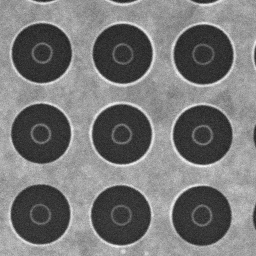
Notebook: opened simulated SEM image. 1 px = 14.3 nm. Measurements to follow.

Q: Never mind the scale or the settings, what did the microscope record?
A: an array of small figures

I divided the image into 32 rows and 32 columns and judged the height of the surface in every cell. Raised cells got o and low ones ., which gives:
ooooooooooooooo.ooooooooo.oooooo
oooooooooooooooooooooooooooooooo
oooooooooooooooooooooooooooooooo
ooo....oooooo.....ooooo....ooooo
oo......oooo.......ooo......oooo
oo.......ooo.......ooo.......ooo
o........oo........ooo.......ooo
o........ooo.......ooo.......ooo
oo.......ooo.......ooo.......ooo
ooo.....ooooo.....ooooo.....oooo
oooooooooooooo..oooooooo...ooooo
oooooooooooooooooooooooooooooooo
oooooooooooooooooooooooooooooooo
ooo....oooooo....ooooooo...ooooo
oo......oooo......oooo......oooo
oo.......ooo.......ooo.......ooo
o........oo........ooo.......ooo
o........oo........ooo.......ooo
oo.......ooo.......ooo.......ooo
ooo.....oooo......ooooo.....oooo
ooooo.oooooooo..oooooooo...ooooo
oooooooooooooooooooooooooooooooo
oooooooooooooooooooooooooooooooo
ooo....oooooo....ooooooo...ooooo
oo......oooo......oooo......oooo
oo.......ooo.......ooo.......ooo
o........oo........oo........ooo
o........oo........oo........ooo
oo......oooo.......ooo.......ooo
oo......oooo......oooo......oooo
oooo..oooooooo...ooooooo...ooooo
oooooooooooooooooooooooooooooooo